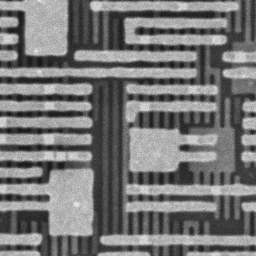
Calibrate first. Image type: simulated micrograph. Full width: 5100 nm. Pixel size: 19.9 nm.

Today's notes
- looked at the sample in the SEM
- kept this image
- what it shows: wiring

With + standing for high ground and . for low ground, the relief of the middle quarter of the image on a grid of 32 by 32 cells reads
................................
++++++++++++++++++++++++++++++++
++++++++++++++++++++++++++++++++
................................
................................
+++++++.........+++++.+++.++++++
+++++++.........++++++++++++++++
...++...........................
................................
+...............++++.......+++++
+++++++.........++++++++++++++++
++.+++..........++++++++++++++++
................++..............
...+++..........++..............
+++++++.........................
+++++++.........................
.................++++++++..+....
.................++++++++++++...
+++++++..........+++++++++++++++
+++++++..........+++++++++++++++
.................++++++++++++...
.................++++++++++++...
+++++++..........+++++++++++++++
+++++++..........+++++++++++++++
.................++++++++++++...
.................+++++++++++....
...++++..........+++++++++++....
+++++++.........................
+++++++.........................
+++++++.........................
+++++++.........++++++++++++++++
+++++++.........++++++++++++++++